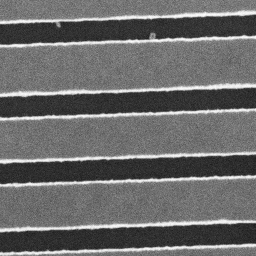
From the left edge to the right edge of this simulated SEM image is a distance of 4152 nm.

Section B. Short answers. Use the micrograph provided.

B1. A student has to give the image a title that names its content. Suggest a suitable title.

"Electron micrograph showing lines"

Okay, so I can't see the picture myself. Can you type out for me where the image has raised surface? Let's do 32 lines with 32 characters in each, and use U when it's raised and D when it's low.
UUUUUUUUUUUUUUUUUUUUUUUUUUUUUUUU
UUUUUUUUUUUUUUUUUUUUUUUUUUUUUUUU
UUUUUUUUUUUDDDDDDDDDDDDDDDDDDDDD
DDDDDDDDDDDDDDDDDDDDDDDDDDDDDDDD
DDDDDDDDDDDDDDDDDDDDDDDDDDDDDDDD
DDDDUUUUUUUUUUUUUUUUUUUUUUUUUUUU
UUUUUUUUUUUUUUUUUUUUUUUUUUUUUUUU
UUUUUUUUUUUUUUUUUUUUUUUUUUUUUUUU
UUUUUUUUUUUUUUUUUUUUUUUUUUUUUUUU
UUUUUUUUUUUUUUUUUUUUUUUUUUUUUUUU
UUUUUUUUUUUUUUUUUUUUUUUUUUUUUUUU
UUUUUUUUUUUUUUUDDDDDDDDDDDDDDDDD
DDDDDDDDDDDDDDDDDDDDDDDDDDDDDDDD
DDDDDDDDDDDDDDDDDDDDDDDDDDDDDDDD
DDDDDDDDDUUUUUUUUUUUUUUUUUUUUUUU
UUUUUUUUUUUUUUUUUUUUUUUUUUUUUUUU
UUUUUUUUUUUUUUUUUUUUUUUUUUUUUUUU
UUUUUUUUUUUUUUUUUUUUUUUUUUUUUUUU
UUUUUUUUUUUUUUUUUUUUUUUUUUUUUUUU
UUUUUUUUUUUUUUUUUUUUUUUDDDDDDDDD
DDDDDDDDDDDDDDDDDDDDDDDDDDDDDDDD
DDDDDDDDDDDDDDDDDDDDDDDDDDDDDDDD
DDDDDDDDDDDDDDDDUUUUUUUUUUUUUUUU
UUUUUUUUUUUUUUUUUUUUUUUUUUUUUUUU
UUUUUUUUUUUUUUUUUUUUUUUUUUUUUUUU
UUUUUUUUUUUUUUUUUUUUUUUUUUUUUUUU
UUUUUUUUUUUUUUUUUUUUUUUUUUUUUUUU
UUUUUUUUUUUUUUUUUUUUUUUUUUUUUUUU
UUUUUUUUUUUDDDDDDDDDDDDDDDDDDDDD
DDDDDDDDDDDDDDDDDDDDDDDDDDDDDDDD
DDDDDDDDDDDDDDDDDDDDDDDDDDDDDDDD
DDDDDDUUUUUUUUUUUUUUUUUUUUUUUUUU